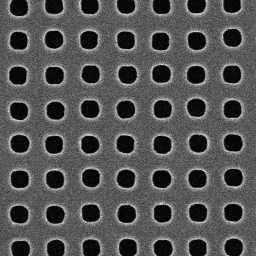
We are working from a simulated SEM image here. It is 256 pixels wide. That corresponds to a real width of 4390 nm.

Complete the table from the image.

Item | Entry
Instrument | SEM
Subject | a regular array of holes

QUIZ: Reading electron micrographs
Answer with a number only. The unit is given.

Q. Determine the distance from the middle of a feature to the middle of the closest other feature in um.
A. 0.588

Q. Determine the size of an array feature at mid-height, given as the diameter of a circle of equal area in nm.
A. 327